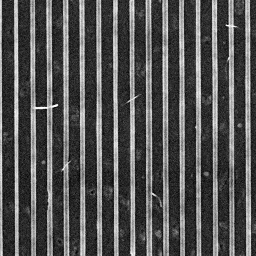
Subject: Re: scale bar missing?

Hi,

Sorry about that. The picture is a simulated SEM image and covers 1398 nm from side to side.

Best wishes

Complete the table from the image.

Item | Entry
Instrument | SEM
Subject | parallel lines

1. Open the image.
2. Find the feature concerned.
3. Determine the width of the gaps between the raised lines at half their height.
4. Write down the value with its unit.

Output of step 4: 66.2 nanometers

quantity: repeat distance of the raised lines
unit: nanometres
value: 90.3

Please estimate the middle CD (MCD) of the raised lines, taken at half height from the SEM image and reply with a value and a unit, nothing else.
25.2 nm